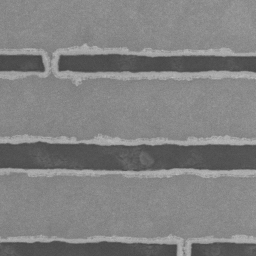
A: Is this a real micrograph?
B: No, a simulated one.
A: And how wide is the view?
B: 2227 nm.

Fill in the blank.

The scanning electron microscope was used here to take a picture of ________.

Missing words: one or a few lines or trenches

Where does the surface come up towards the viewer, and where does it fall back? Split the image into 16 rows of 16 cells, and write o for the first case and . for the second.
oooooooooooooooo
oooooooooooooooo
oooooooooooooooo
...o............
...o............
oooooooooooooooo
oooooooooooooooo
oooooooooooooooo
oooooooooooooooo
................
................
oooooooooooooooo
oooooooooooooooo
oooooooooooooooo
oooooooooooooooo
...........o....